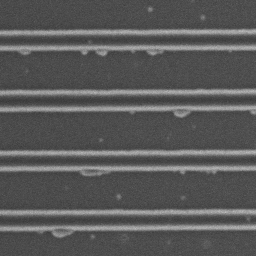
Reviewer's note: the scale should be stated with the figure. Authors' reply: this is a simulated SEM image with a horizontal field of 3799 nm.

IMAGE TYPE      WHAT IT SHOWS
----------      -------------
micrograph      lines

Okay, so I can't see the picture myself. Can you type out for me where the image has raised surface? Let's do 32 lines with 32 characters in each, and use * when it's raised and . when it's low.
................................
................................
................................
................................
********************************
********************************
................................
................................
................................
................................
................................
........................**....**
********************************
********************************
................................
................................
................................
................................
................................
********************************
********************************
................................
................................
................................
................................
................................
..............*......*..********
********************************
*******************.............
................................
................................
................................